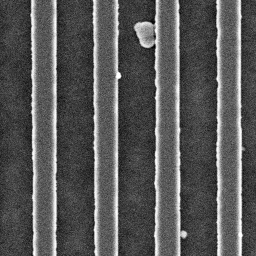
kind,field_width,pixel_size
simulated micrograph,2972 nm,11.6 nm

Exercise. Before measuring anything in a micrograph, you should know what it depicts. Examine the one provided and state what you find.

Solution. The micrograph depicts lines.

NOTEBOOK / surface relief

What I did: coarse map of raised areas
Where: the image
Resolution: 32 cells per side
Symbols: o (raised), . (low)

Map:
....ooo.....ooo.....oo.....ooo..
....ooo.....ooo.....oo.....ooo..
....ooo.....ooo....ooo.....ooo..
....ooo.....ooo...oooo.....ooo..
....ooo.....ooo...oooo.....ooo..
....ooo.....ooo....ooo.....ooo..
....ooo.....ooo....ooo.....ooo..
....ooo.....ooo....ooo.....ooo..
....ooo.....ooo....ooo.....ooo..
....ooo.....ooo.....oo.....ooo..
....ooo.....ooo....ooo.....ooo..
....ooo.....ooo.....oo.....ooo..
....ooo.....ooo....ooo.....ooo..
....ooo.....ooo.....oo.....ooo..
....ooo.....ooo.....oo.....ooo..
....ooo.....ooo.....oo.....ooo..
....ooo.....ooo....ooo.....ooo..
....ooo.....ooo.....oo.....ooo..
....ooo.....ooo.....oo.....ooo..
....ooo.....ooo....ooo.....ooo..
....ooo.....ooo....ooo.....ooo..
....ooo.....ooo....ooo.....ooo..
....ooo.....ooo....ooo.....ooo..
....ooo.....ooo....ooo.....ooo..
....ooo.....ooo.....oo.....ooo..
....ooo.....ooo....ooo.....ooo..
....ooo.....ooo....ooo.....ooo..
....ooo.....ooo....ooo.....ooo..
....ooo.....ooo....ooo.....ooo..
....ooo.....ooo....ooo.....ooo..
....ooo.....ooo....ooo.....ooo..
....ooo.....ooo....ooo.....ooo..